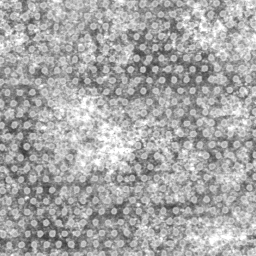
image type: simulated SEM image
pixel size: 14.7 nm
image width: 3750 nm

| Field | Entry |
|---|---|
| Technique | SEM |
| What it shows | a regular array of raised bodies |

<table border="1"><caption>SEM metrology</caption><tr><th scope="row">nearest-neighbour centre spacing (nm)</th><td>176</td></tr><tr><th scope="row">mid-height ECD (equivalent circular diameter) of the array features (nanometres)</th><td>82.7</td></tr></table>